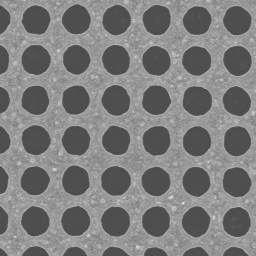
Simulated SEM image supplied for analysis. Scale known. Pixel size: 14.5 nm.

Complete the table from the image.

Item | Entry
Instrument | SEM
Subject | a regular array of holes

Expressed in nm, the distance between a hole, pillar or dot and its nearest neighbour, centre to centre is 582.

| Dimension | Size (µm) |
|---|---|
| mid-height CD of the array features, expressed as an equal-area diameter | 0.424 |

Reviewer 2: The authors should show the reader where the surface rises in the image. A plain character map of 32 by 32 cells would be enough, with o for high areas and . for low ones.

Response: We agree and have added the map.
oooooooooooooooooooooooooooooooo
.oo...oo...oo...oo...oo...oo...o
.oo...oo...oo...oo...oo...oo...o
.oo...oo...oo...oo...oo...oo...o
oooooooooooooooooooooooooooooooo
oooooooooooooooooooooooooooooooo
.oo...oo...oo...oo...oo...oo...o
.oo...oo...oo...oo...oo...oo...o
.oo...oo...oo...oo...oo...oo...o
oooooooooooooooooooooooooooooooo
oooooooooooooooooooooooooooooooo
.oo...oo...oo...oo...oo...oo...o
.oo...oo...oo...oo...oo...oo...o
.oo...oo...oo...oo...oo...oo...o
oooooooooooooooooooooooooooooooo
oooooooooooooooooooooooooooooooo
.oo...oo...oo...oo...oo...oo...o
.oo...oo...oo...oo...oo...oo...o
.oo...oo...oo...oo...oo...oo...o
oooooooooooooooooooooooo.oooo.oo
oooooooooooooooooooooooooooooooo
.oo...oo...oo...oo...oo...oo...o
.oo...oo...oo...oo...oo...oo...o
.oo...oo...oo...oo...oo...oo...o
oooooooooooooooooooooooo.oooo.oo
oooooooooooooooooooooooooooooooo
.oo...oo...oo...oo...oo...oo...o
.oo...oo...oo...oo...oo...oo...o
.oo...oo...oo...oo...oo...oo...o
oooo.oooo.oooo.oooo.oooo.oooo.oo
oooooooooooooooooooooooooooooooo
.oo...oo...oo...oo...oo...oo...o